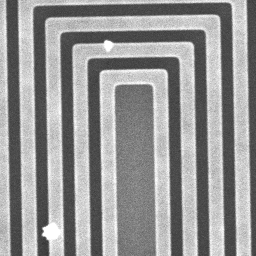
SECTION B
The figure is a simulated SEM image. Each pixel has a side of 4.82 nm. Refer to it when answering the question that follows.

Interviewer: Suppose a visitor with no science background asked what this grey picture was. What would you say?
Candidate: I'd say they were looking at groups of lines, slits or small figures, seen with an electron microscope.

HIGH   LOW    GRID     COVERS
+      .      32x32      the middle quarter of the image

..++++.......................+++
..++++.......................+++
..++++...+++++++++++++++++...+++
..++++...+++++++++++++++++...+++
..++++...+++++++++++++++++...+++
..++++...++++.........++++...+++
...+++...+++..........++++...+++
...+++...+++..........++++...+++
...+++...+++..........++++...+++
...+++...+++..........++++...+++
...+++...++++.........++++...+++
...+++...++++..........+++...+++
...+++...++++..........+++...+++
...+++...++++..........+++...+++
...+++...++++..........+++...+++
...+++...++++..........+++...+++
...+++...++++..........+++...+++
...+++...++++..........+++...+++
...+++...++++..........+++...+++
...+++...++++..........+++...+++
...+++...++++..........+++...+++
...+++...++++..........+++....++
...+++...++++..........+++....++
...+++...++++..........+++....++
...+++...++++..........+++....++
...+++...++++..........+++....++
...+++...++++..........+++....++
...+++...++++..........+++....++
...+++....+++..........+++....++
...+++....+++..........+++....++
...+++....+++..........+++....++
...+++....+++..........+++....++